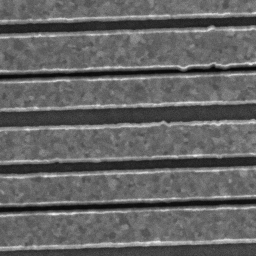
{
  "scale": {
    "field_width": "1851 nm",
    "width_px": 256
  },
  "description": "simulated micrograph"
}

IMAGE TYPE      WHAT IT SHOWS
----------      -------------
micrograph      parallel lines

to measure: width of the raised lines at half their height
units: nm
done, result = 247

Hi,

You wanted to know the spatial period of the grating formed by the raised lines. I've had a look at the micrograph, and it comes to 320 nm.